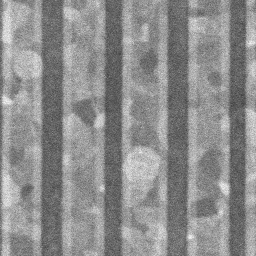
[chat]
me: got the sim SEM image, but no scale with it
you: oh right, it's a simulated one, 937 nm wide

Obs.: one or a few lines or trenches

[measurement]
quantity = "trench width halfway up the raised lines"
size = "102 nm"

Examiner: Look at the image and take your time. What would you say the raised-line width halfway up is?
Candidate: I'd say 120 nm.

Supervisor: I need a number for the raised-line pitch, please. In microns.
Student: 0.228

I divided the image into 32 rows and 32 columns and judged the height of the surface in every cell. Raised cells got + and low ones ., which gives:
.++++...+++++...++++....++++...+
.++++...+++++...++++....++++...+
.++++...+++++...++++....++++...+
.++++...+++++...++++....++++...+
.++++...+++++...++++....++++...+
.++++...+++++...++++....++++...+
.++++...+++++...++++....++++...+
.++++...+++++...++++....++++...+
.++++...+++++...++++....++++...+
.++++...+++++...++++....++++...+
.++++...+++++...++++....++++...+
.++++...+++++...++++....++++...+
.++++...+++++...++++....++++...+
.++++...+++++...++++....++++...+
.++++...+++++...++++....++++...+
.++++...+++++...++++....++++...+
.++++...+++++...++++....++++...+
.++++...+++++...++++....++++...+
.++++...+++++...++++....++++...+
.++++...+++++...++++....++++...+
.++++...+++++...++++....++++...+
.++++...+++++...++++....++++...+
.++++...++++....++++....++++...+
.++++...++++....++++....++++...+
.++++...++++....++++....++++...+
.++++...++++....++++....++++...+
.++++...++++....++++....++++...+
.++++...++++....++++....++++...+
.++++...++++....++++....++++...+
.++++...++++....++++....++++...+
.++++...++++....++++....++++...+
.++++...++++....++++....++++...+